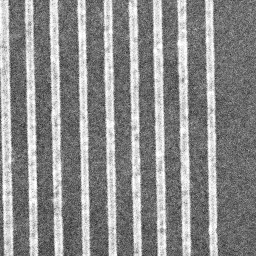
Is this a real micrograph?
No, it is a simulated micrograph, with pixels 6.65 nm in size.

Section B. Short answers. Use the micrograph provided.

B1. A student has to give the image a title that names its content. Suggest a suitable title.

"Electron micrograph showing parallel lines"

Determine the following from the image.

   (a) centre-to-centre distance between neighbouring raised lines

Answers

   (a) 171 nm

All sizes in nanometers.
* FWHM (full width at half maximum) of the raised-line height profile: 44.9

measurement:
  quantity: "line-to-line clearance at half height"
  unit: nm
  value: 124